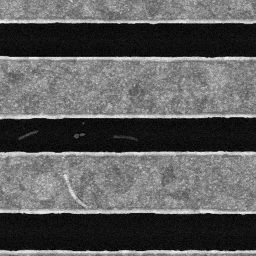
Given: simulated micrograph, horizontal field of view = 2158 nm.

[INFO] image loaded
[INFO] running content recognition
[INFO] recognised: lines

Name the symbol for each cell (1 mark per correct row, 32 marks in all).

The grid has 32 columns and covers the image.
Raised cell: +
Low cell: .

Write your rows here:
++++++++++++++++++++++++++++++++
++++++++++++++++++++++++++++++++
++++++++++++++++++++++++++++++++
................................
................................
................................
................................
++++++++++++++++++++++++++++++++
++++++++++++++++++++++++++++++++
++++++++++++++++++++++++++++++++
++++++++++++++++++++++++++++++++
++++++++++++++++++++++++++++++++
++++++++++++++++++++++++++++++++
++++++++++++++++++++++++++++++++
++++++++++++++++++++++++++++++++
................................
................................
................................
................................
++++++++++++++++++++++++++++++++
++++++++++++++++++++++++++++++++
++++++++++++++++++++++++++++++++
++++++++++++++++++++++++++++++++
++++++++++++++++++++++++++++++++
++++++++++++++++++++++++++++++++
++++++++++++++++++++++++++++++++
..+++++++++++++++.++++++++++++++
................................
................................
................................
................................
++++++++++++++++++++++++++++++++